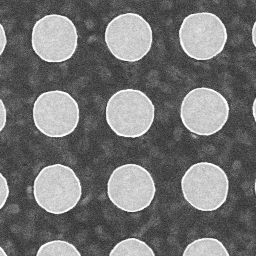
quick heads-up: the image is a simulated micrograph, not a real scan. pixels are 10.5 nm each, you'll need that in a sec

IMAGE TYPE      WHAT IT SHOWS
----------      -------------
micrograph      a regular array of raised bodies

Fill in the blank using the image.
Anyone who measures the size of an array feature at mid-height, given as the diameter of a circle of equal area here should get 490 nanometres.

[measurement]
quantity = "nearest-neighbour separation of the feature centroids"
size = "776 nm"